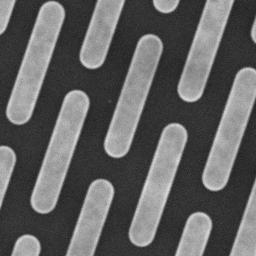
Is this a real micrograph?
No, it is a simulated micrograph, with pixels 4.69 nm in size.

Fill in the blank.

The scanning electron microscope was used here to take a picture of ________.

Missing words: groups of lines, slits or small figures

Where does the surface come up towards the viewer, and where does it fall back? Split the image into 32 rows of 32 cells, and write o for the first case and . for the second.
oo....o.....ooo....ooo....ooo...
o....ooo....ooo.....o....oooo...
o....ooo...oooo..........ooo....
o...oooo...ooo...........ooo....
....ooo....ooo....o.....oooo...o
....ooo...oooo...ooo....ooo.....
...oooo...ooo....ooo....ooo.....
...ooo....ooo....ooo...oooo.....
...ooo..........oooo...ooo......
..ooo...........ooo....ooo....oo
..ooo...........ooo...oooo...ooo
..ooo....o.....oooo...ooo....ooo
.oooo...ooo....ooo.....o....oooo
.ooo....ooo....ooo..........oooo
.ooo...oooo...oooo..........ooo.
.......ooo....ooo..........oooo.
.......ooo....ooo...ooo....oooo.
......oooo...oooo...ooo....ooo..
o.....ooo....ooo....ooo...oooo..
oo....ooo.....o....oooo...ooo...
oo...oooo..........ooo....ooo...
oo...ooo...........ooo...oooo...
o....ooo..........oooo...ooo....
o...oooo...ooo....ooo.....oo....
o...ooo....ooo....ooo..........o
....ooo...oooo...oooo..........o
.....o....ooo....ooo...........o
..........ooo....ooo...ooo....oo
.........oooo...oooo...ooo....oo
...o.....ooo....ooo....ooo....oo
..ooo....ooo.....oo...oooo...ooo
..ooo...oooo..........ooo....ooo